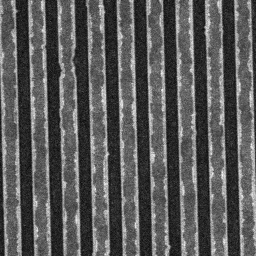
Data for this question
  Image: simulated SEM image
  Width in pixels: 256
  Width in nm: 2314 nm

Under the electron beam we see parallel lines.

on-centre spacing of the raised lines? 0.266 microns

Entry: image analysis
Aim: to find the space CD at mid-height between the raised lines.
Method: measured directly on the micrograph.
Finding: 123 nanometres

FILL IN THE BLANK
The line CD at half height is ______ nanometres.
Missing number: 140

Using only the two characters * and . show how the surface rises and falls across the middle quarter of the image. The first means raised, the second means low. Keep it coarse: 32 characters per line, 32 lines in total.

**....****....****...****...****
***...****....****...****...****
***...****....****...****...****
***...****....****...****....***
***....***....****...****....***
***....***....****...****....***
***....***....****...****....***
***....***....****...****....***
***....***....****...****....***
***....***....****...****....***
***....***....****...****....***
***....***....****...****....***
***....***....****...****....***
***....***....****...****....***
***....***....****....***....***
***....***....****....***....***
***....***....****....***....***
***....***....****....***....***
***....***....****....***....***
***....****...****....***....***
***....****...****....***....***
***....****...****....***....***
***....****...****....***....***
***....****...****....***....***
***....****...****....***....***
***....****....***....***....***
***....****....***....***....***
***....****....***....***....***
***....****....***....***....***
***....****....***....****...***
****...****....***....****...***
****...****....***....****...***